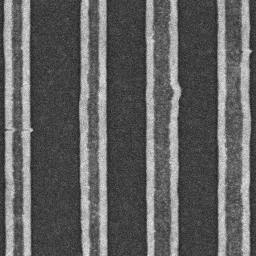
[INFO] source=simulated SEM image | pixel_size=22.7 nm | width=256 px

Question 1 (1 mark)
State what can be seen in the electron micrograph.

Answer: one or a few lines or trenches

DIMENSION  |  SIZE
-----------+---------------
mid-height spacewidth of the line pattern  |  1100 nanometres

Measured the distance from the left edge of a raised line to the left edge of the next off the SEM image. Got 1630 nm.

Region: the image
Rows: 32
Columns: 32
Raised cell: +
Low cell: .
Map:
.++........++......+++......+++.
.++........++......+++......+++.
.++........++......+++......+++.
.++........++......+++......+++.
.++........++......+++......+++.
.++........++......+++......+++.
.++........++......+++......+++.
.++........++......+++......+++.
.++........++......+++......+++.
.++........++......+++......+++.
.++........++......+++......++..
.++........++......+++......++..
.++........++......+++......+++.
.++.......+++......+++......+++.
.++.......+++......+++......+++.
.++........++......+++......+++.
.++........++......+++......+++.
.++........++......+++......+++.
.++........++......+++......+++.
.++........++......+++......+++.
.++........++......+++......+++.
.++........++......+++......+++.
.++........++......+++......+++.
.++........++......+++......+++.
.++........++......+++......+++.
.++........++......+++......+++.
.++........++......+++......+++.
.++........++......+++......+++.
.++........++......+++......+++.
.++........++......+++......+++.
.++........++......+++......+++.
.++........++......+++......+++.